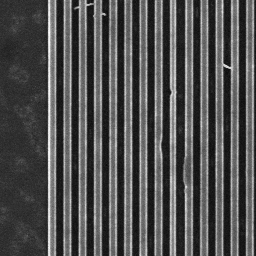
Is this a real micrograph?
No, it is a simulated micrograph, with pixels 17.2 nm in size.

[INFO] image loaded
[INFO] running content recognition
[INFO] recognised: parallel lines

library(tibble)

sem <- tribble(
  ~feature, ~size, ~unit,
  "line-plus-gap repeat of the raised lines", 0.262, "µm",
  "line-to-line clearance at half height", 153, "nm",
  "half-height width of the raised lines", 108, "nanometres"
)